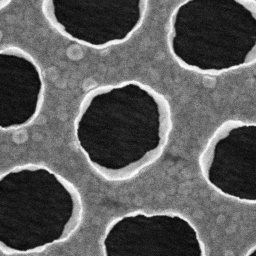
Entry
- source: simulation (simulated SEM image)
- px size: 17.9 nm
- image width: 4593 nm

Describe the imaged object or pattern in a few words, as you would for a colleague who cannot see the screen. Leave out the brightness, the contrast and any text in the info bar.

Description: holes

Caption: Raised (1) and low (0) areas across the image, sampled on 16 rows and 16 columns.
1110000001100001
1111000001100000
1111100111100000
0111111111100000
0011111111111111
0001111001111111
0011110000111111
0011100000111111
1111100000111100
1111100000111000
1111110001111000
0000111111111000
0000011111111111
0000011100011111
0000111000001111
1011111000000111